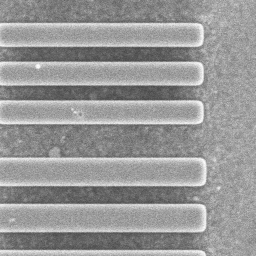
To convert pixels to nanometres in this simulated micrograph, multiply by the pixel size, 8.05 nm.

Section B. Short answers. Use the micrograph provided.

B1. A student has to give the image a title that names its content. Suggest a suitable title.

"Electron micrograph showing groups of lines, slits or small figures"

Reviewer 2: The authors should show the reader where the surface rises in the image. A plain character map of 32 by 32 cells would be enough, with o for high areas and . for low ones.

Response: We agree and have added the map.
................................
................................
................................
ooooooooooooooooooooooooo.......
ooooooooooooooooooooooooo.......
ooooooooooooooooooooooooo.......
................................
................................
ooooooooooooooooooooooooo.......
ooooooooooooooooooooooooo.......
ooooooooooooooooooooooooo.......
................................
................................
ooooooooooooooooooooooooo.......
ooooooooooooooooooooooooo.......
................................
................................
................................
................................
................................
oooooooooooooooooooooooooo......
oooooooooooooooooooooooooo......
oooooooooooooooooooooooooo......
................................
................................
................................
oooooooooooooooooooooooooo......
oooooooooooooooooooooooooo......
oooooooooooooooooooooooooo......
................................
................................
ooooooooooooooooooooooooo.......